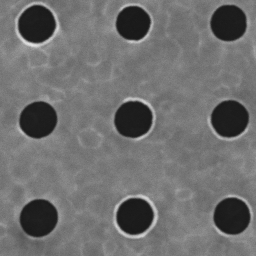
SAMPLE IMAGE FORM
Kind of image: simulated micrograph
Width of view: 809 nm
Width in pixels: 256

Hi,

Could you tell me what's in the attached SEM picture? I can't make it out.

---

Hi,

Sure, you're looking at a regular array of holes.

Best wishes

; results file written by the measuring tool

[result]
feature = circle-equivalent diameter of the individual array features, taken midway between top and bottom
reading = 0.117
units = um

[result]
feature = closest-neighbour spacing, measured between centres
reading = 303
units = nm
